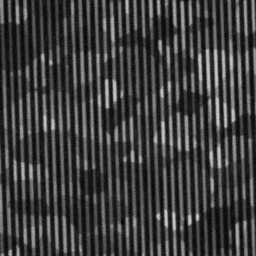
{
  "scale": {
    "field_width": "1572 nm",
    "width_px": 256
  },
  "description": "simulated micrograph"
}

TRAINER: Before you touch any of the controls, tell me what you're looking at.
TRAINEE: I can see parallel lines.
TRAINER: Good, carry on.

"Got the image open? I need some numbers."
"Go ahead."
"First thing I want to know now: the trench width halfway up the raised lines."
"30.7 nanometres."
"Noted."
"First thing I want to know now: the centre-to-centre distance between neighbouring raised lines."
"48.2 nm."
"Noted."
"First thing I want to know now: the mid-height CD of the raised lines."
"15.3 nanometres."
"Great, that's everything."